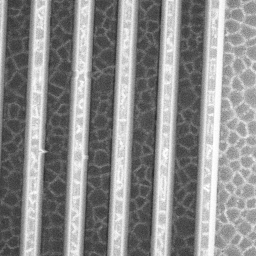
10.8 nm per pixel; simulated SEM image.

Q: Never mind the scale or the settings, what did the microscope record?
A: parallel lines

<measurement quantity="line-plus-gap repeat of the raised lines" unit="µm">0.469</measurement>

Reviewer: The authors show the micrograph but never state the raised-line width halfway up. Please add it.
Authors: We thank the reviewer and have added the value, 156 nanometers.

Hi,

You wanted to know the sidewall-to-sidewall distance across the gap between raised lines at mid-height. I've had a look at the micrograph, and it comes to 311 nm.